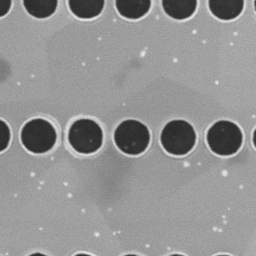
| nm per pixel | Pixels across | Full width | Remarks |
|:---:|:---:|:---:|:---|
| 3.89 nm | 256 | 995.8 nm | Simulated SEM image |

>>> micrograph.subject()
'holes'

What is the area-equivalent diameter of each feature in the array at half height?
142 nm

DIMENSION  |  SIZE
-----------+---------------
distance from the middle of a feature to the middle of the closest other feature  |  180 nm